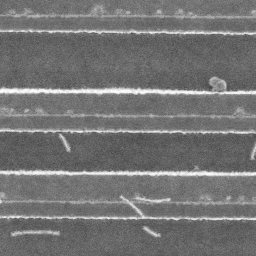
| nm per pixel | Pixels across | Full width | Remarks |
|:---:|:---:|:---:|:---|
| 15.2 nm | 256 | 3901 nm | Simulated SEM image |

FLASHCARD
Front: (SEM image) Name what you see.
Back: lines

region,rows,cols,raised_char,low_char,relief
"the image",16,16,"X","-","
XXXXXXXXXXXXXXXX
XXXXXXXXXXXXXXXX
----------------
----------------
----------------
----------------
XXXXXXXXXXXXXXXX
XXXXXXXXXXXXXXXX
----------------
----------------
----------------
XXXXXXXXXXXXXXXX
XXXXXXXXXXXXXXXX
XXXXXXXXXXXXXXXX
----------------
----------------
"